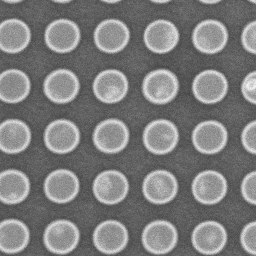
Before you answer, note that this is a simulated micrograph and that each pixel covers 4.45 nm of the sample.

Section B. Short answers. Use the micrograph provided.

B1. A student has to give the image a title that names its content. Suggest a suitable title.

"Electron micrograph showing a regular array of raised bodies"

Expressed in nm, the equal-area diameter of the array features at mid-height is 149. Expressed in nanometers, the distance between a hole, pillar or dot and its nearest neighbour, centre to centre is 219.